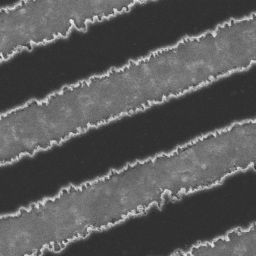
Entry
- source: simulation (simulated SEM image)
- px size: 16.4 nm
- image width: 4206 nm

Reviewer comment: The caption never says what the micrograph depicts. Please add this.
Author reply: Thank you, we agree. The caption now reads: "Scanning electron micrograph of one or a few lines or trenches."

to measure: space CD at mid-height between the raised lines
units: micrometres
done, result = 0.71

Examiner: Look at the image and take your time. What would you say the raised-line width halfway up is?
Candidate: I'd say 876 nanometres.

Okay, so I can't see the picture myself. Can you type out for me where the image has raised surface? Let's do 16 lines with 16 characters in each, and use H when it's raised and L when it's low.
HLLLLLLLHHHHHHHH
LLLLLHHHHHHHHHLL
LLLHHHHHHHHHLLLL
HHHHHHHHHLLLLLLL
HHHHHHHLLLLLLLHH
HHHHLLLLLLLLHHHH
HHLLLLLLLHHHHHHH
LLLLLLLHHHHHHHHH
LLLLHHHHHHHHHLLL
LLHHHHHHHHHLLLLL
HHHHHHHHLLLLLLLH
HHHHHLLLLLLLLHHH
HHHLLLLLLLHHHHHH
HLLLLLLLHHHHHHHH
LLLLLHHHHHHHHHHL
LLLLHHHHHHHHLLLL